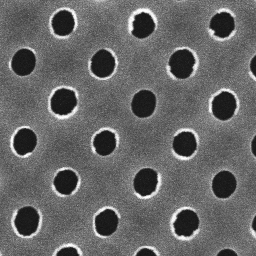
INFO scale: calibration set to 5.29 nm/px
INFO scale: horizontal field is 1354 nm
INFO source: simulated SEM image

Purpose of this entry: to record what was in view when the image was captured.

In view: a regular array of holes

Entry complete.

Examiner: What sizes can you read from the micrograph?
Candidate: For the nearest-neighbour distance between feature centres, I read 291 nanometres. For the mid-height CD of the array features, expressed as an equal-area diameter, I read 0.138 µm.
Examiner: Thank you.